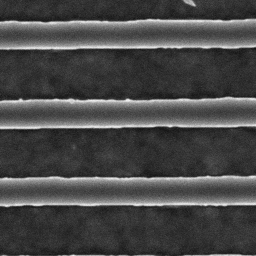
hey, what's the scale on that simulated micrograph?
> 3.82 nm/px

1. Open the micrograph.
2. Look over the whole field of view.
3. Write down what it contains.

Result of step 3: lines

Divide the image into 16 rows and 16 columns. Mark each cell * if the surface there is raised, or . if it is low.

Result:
................
****************
****************
................
................
................
****************
****************
................
................
................
****************
****************
................
................
................